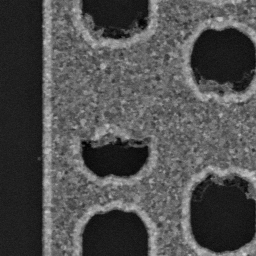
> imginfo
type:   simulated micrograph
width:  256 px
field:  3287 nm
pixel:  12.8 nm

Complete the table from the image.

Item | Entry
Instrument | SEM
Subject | one or a few lines or trenches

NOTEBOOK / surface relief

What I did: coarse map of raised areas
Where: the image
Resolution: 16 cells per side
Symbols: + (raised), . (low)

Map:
...++.....++++++
...++.....++++.+
...+++..++++....
...+++++++++....
...+++++++++....
...+++++++++....
...+++++++++++++
...+++++++++++++
...+++..++++++++
...++.....++++++
...++....+++++++
...+++++++++....
...+++++++++....
...++....+++....
...++.....++....
...++.....++....